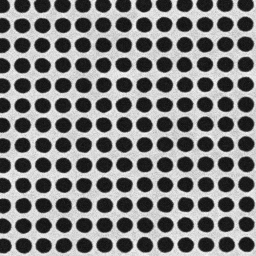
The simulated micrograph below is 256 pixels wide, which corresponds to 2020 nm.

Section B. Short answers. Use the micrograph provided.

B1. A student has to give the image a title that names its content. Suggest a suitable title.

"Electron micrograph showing a regular array of holes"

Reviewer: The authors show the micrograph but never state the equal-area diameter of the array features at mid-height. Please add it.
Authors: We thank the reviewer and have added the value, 126 nanometers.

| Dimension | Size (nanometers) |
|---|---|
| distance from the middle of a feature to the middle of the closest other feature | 157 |